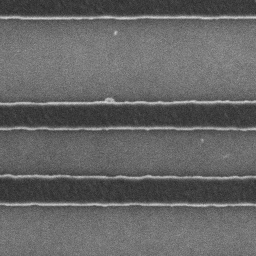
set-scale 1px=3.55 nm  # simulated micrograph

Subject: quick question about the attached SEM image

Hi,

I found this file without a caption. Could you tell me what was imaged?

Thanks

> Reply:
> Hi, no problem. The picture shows lines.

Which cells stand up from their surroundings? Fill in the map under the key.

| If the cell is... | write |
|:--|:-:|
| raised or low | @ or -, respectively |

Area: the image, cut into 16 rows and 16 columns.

@@@@@@@@@@@@@@@@
----------------
----------------
----------------
----------------
----------------
@@@@@@@@@@@@@@@@
@@@@@@@@@@@@@@@@
----------------
----------------
----------------
@@@@@@@@@@@@@@@@
@@@@@@@@@@@@@@@@
----------------
----------------
----------------